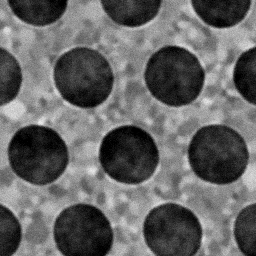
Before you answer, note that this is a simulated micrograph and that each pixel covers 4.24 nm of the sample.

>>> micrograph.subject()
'holes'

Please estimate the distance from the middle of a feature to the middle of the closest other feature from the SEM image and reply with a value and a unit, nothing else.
0.379 microns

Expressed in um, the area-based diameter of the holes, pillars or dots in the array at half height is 0.265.